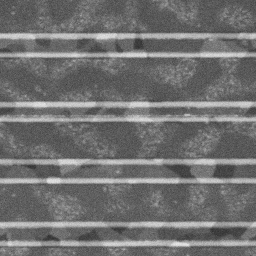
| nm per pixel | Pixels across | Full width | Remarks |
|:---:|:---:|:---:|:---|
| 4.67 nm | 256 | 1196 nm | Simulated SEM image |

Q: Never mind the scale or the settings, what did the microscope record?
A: parallel lines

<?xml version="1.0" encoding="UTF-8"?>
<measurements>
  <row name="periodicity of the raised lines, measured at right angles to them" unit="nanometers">293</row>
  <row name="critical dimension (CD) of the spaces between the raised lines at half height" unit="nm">201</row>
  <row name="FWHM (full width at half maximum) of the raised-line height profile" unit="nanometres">89.3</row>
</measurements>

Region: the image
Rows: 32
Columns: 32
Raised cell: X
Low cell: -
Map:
--------------------------------
--------------------------------
--------------------------------
--------------------------------
--XX-XXXXX--X-XXX---XX-XXXXXXX-X
XXXXXXXXXXXXXXXXXXXXXXXXXXXXXXXX
XXXXXXXXXXXXXXXXXXXXXXXXXXXXXXXX
--------------------------------
--------------------------------
--------------------------------
--------------------------------
--------------------------------
--------------------------------
XXXXXXXXXXXXXXXXXXXXXXXXXXXXXXXX
XXXXXXXXXXXXXXXXXXXXXXXXXXXXXXXX
--------------------------------
--------------------------------
--------------------------------
--------------------------------
--------------------------------
XXXXXXXXXXXXXXXXXXXXXXXXXXXXXXXX
XXXXXXXXXXXXXXXXXXXXXXXXXXXXXXXX
XXXXXXXXXXXXXXXXXXXXXXXXXXXXXXXX
--------------------------------
--------------------------------
--------------------------------
--------------------------------
--------------------------------
XXXXXXXXXXXXXXXXXXXXXXXXXXXXXXXX
XXXXXXXXXXXXXXXXXXXXXXXXXXXXXXXX
--------------------------------
--------------------------------